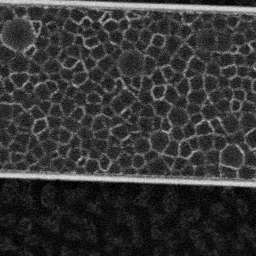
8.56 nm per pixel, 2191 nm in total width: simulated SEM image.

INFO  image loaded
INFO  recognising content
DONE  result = one or a few lines or trenches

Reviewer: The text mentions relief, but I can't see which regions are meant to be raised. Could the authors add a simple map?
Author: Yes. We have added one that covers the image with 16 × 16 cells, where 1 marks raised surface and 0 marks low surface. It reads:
1111111111111000
1111111111111111
1111111111111111
1111111111111111
1111111111111111
1111111111111111
1111111111111111
1111111111111111
1111111111111111
1111111111111111
1111111111111111
0000000000000001
0000000000000000
0000000000000000
0000000000000000
0000000000000000